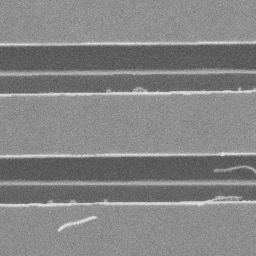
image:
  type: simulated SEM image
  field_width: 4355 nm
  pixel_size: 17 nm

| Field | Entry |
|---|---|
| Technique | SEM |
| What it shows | lines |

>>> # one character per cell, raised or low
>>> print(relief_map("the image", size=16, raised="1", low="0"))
1111111111111111
1111111111111111
1111111111111111
0000000000000000
0000000000000000
0000000000000000
1111111111111111
1111111111111111
1111111111111111
1111111111111111
0000000000000000
0000000000000000
0000000000000000
1111111111111111
1111111111111111
1111111111111111